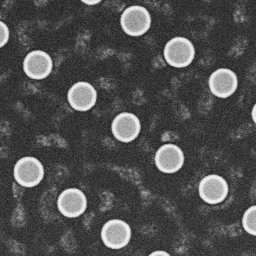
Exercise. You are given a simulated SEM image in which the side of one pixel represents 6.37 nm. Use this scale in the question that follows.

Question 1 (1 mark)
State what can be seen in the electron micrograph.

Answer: a regular array of raised bodies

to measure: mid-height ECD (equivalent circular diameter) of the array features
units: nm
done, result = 172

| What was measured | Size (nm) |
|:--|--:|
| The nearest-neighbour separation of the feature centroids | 341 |